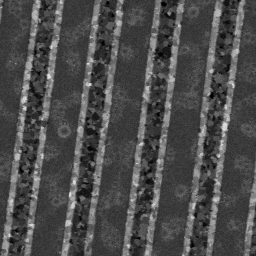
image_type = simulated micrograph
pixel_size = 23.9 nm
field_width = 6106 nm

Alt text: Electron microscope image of parallel lines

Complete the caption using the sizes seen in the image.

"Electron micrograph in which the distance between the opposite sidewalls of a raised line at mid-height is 538 nanometers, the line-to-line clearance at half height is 0.902 um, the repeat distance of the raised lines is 60.1 px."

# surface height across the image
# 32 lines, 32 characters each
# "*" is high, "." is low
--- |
.....***....***.....***....***..
....***.....***.....**.....***..
....***.....***.....**.....***..
....***.....***....***.....***..
....***.....***....***.....***..
....***.....**.....***.....**...
....***....***.....***.....**...
....***....***.....***....***...
....**.....***.....***....***...
...***.....***.....**.....***...
...***.....***.....**.....***...
...***.....***....***.....***...
...***.....**.....***.....***...
...***.....**.....***.....**....
...***....***.....***.....**....
...**.....***.....***....***....
..***.....***.....***....***....
..***.....***.....**.....***....
..***.....***....***.....***....
..***.....***....***.....***....
..***.....**.....***.....***....
..***....***.....***.....**.....
..***....***.....***.....**.....
..**.....***.....***....***.....
.***.....***.....***....***.....
.***.....***.....**.....***.....
.***.....***....***.....***.....
.***.....**.....***.....***....*
.***.....**.....***.....**.....*
.***....***.....***.....**.....*
.**.....***.....***....***.....*
.**.....***.....***....***.....*